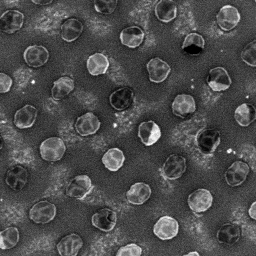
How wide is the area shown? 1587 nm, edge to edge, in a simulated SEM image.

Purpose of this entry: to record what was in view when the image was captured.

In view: a regular array of raised bodies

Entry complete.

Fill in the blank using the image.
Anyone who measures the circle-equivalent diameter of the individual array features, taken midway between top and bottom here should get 137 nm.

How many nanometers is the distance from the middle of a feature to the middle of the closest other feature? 265